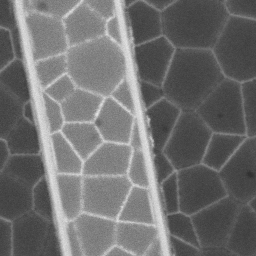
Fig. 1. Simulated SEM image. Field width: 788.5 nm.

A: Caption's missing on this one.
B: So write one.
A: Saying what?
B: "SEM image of one or a few lines or trenches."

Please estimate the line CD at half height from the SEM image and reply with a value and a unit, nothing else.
303 nanometres